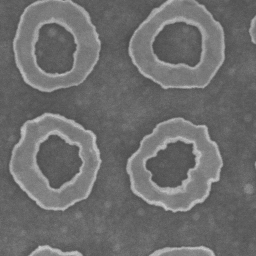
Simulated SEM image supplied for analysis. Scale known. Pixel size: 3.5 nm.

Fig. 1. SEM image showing ring-shaped raised bodies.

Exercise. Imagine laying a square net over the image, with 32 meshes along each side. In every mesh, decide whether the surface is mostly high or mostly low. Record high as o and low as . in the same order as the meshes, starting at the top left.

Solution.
....ooooo............oooo.......
...oooooooo........ooooooo......
...oooooooo.......oooo.oooo.....
..ooo...oooo.....ooo.....ooo...o
..ooo....ooo.....oo......ooo...o
..oo......ooo...ooo......ooo....
..oo.....ooo....ooo......ooo....
..oo.....ooo.....ooo.....ooo....
..ooo....ooo.....oooooooooo.....
...oooooooo.......ooooooooo.....
....oooooo..........oooooo......
................................
................................
................................
.....oo.........................
...ooooooo..........oooo........
...oooooooo........ooooooo......
...oo...oooo......oooo.ooo......
..ooo.....oo.....ooo....ooo.....
.ooo......oo.....oo......oo.....
.ooo......oo....oo.......ooo....
.oooo.....oo....ooo.....ooo.....
..oooo...ooo....ooo....oooo.....
...oooo.ooo......ooo...ooo......
....ooooooo.......oooooooo......
.....oooo...........oooo........
................................
................................
................................
................................
................................
....oooo............oooooo......